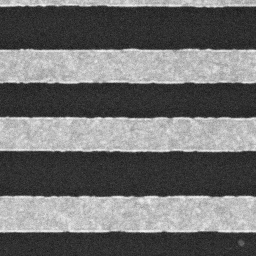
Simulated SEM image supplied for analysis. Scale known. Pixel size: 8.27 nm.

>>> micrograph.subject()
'lines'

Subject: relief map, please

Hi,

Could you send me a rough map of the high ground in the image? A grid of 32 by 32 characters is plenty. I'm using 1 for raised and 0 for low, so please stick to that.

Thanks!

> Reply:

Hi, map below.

11111111111111111111111111111111
00000000000000000000000000000000
00000000000000000000000000000000
00000000000000000000000000000000
00000000000000000000000000000000
00000000000000000000000000000000
11111111111111111111111111111111
11111111111111111111111111111111
11111111111111111111111111111111
11111111111111111111111111111111
00000000000000000000000000000000
00000000000000000000000000000000
00000000000000000000000000000000
00000000000000000000000000000000
00000000000000000000000000000000
11111111111111111111111111111111
11111111111111111111111111111111
11111111111111111111111111111111
11111111111111111111111111111111
00000000000000000000000000000000
00000000000000000000000000000000
00000000000000000000000000000000
00000000000000000000000000000000
00000000000000000000000000000000
00000000000000000000000000000000
11111111111111111111111111111111
11111111111111111111111111111111
11111111111111111111111111111111
11111111111111111111111111111111
00000000000000000000000000000000
00000000000000000000000000000000
00000000000000000000000000000000